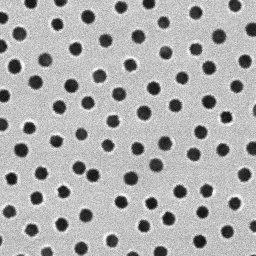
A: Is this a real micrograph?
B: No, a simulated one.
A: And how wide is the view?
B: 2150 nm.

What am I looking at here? a regular array of holes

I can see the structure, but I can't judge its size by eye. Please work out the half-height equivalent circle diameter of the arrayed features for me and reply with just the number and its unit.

121 nm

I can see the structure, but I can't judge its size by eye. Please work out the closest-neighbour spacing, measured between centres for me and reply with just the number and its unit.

218 nm